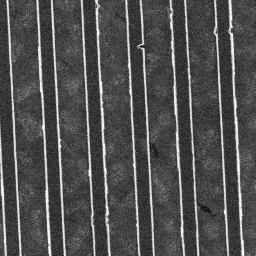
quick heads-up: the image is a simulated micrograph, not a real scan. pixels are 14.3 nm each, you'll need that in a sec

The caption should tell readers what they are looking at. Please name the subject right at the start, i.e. parallel lines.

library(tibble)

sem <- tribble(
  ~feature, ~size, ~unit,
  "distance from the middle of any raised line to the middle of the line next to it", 633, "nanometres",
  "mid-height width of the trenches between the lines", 29.7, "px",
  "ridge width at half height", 15.2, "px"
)